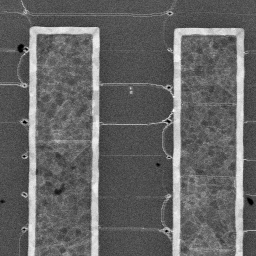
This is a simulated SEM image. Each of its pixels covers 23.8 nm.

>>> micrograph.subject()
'wiring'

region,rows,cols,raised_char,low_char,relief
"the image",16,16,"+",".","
................
................
..++++.....++++.
..++++.....++++.
..++++.....++++.
..++++.....++++.
..++++.....++++.
..++++.....++++.
..++++.....++++.
..++++.....++++.
..++++.....++++.
..++++.....++++.
..++++.....++++.
..++++.....++++.
..++++.....++++.
..++++.....++++.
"